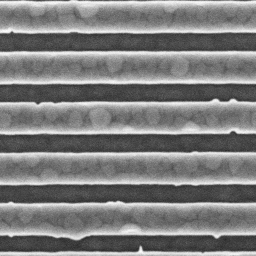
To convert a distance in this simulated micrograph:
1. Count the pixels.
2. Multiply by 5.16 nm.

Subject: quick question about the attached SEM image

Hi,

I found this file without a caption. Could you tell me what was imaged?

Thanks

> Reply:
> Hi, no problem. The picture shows parallel lines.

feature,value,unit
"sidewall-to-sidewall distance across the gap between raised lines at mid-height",96.8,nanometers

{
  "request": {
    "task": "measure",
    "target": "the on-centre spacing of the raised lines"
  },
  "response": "0.261 micrometres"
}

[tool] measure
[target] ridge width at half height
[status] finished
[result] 0.161 microns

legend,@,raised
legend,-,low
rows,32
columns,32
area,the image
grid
@@@@@@@@@@@@@@@@@@@@@@@@@@@@@@@@
@@@@@@@@@@@@@@@@@@@@@@@@@@@@@@@@
@@@@@@@@@@@@@@@@@@@@@@@@@@@@@@@@
@@@@@@@@@@@@@@@@@@@@@@@@@@@@@@@@
--------------------------------
--------------------------------
---------------------@@@@@@-@@--
@@@@@@@@@@@@@@@@@@@@@@@@@@@@@@@@
@@@@@@@@@@@@@@@@@@@@@@@@@@@@@@@@
@@@@@@@@@@@@@@@@@@@@@@@@@@@@@@@@
--------------------------------
--------------------------------
--------------------------------
@@@@@@@@@@@@@@@@@@@@@@@@@@@@@@@@
@@@@@@@@@@@@@@@@@@@@@@@@@@@@@@@@
@@@@@@@@@@@@@@@@@@@@@@@@@@@@@@@@
@@@@@@@@@@@@@@@@@@@@@@@@@@@@@@@@
--------------------------------
--------------------------------
@@@@@@@@@@@@@@@@@@@@@@@@@@@@@@@@
@@@@@@@@@@@@@@@@@@@@@@@@@@@@@@@@
@@@@@@@@@@@@@@@@@@@@@@@@@@@@@@@@
@@@@@@@@@@@@@@@@@@@@@@@@@@@@@@@@
--------------------------------
--------------------------------
@@@-@@@@@@@@@@@@@@@@@@@@@@@@@@@@
@@@@@@@@@@@@@@@@@@@@@@@@@@@@@@@@
@@@@@@@@@@@@@@@@@@@@@@@@@@@@@@@@
@@@@@@@@@@@@@@@@@@@@@@@@@@@@@@@@
-------@@@@----------------@----
--------------------------------
--------@@-------@-@------------